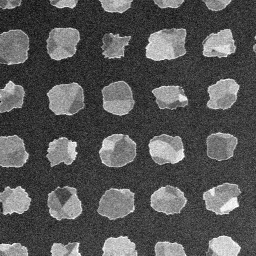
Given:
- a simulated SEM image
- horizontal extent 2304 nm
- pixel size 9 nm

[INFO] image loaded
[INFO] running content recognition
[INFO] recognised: a regular array of raised bodies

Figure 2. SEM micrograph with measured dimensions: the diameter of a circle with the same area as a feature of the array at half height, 32.3 pixels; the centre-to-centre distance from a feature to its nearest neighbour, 466 nanometers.